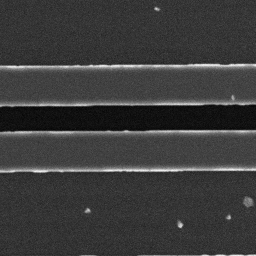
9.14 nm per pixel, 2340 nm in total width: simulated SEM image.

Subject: lines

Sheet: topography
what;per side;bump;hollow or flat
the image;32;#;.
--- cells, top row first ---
................................
................................
................................
................................
................................
................................
................................
................................
################################
################################
################################
################################
################################
................................
................................
................................
################################
################################
################################
################################
################################
................................
................................
................................
................................
................................
................................
................................
................................
................................
................................
................................